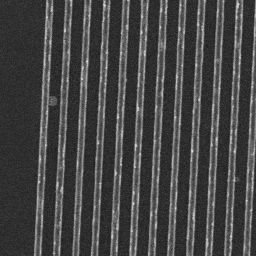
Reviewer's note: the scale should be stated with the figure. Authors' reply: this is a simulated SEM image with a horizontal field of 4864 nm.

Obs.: parallel lines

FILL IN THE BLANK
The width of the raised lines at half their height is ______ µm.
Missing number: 0.119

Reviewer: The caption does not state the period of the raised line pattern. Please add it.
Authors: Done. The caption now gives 19 px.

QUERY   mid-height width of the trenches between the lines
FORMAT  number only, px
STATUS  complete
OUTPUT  12.4